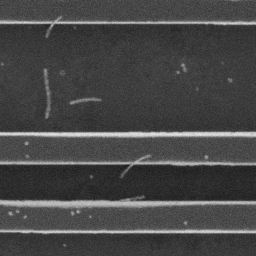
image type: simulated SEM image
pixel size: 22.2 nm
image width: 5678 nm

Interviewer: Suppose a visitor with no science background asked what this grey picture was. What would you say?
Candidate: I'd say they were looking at lines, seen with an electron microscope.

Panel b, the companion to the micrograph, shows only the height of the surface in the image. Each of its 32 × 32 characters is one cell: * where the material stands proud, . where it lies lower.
********************************
********************************
********************************
................................
................................
................................
................................
................................
................................
................................
................................
................................
................................
................................
................................
................................
................................
********************************
********************************
********************************
................*............***
................................
................................
................................
................................
********************************
********************************
********************************
********************************
................................
................................
................................